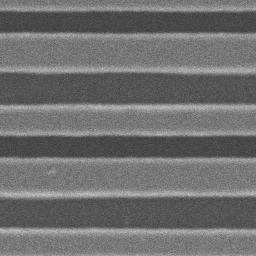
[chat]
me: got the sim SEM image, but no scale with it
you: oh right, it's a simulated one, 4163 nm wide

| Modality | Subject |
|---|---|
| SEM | lines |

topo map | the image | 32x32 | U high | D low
UUUUUUUUUUUUUUUUUUUUUUUUUUUUUUUU
DDDDDDDDDDDDDDDDDDDDDDDDDDDDDDDD
DDDDDDDDDDDDDDDDDDDDDDDDDDDDDDDD
DDDDDDDDDDDDDDDDDDDDDDDDDDDDDDDD
UUUUUUUUUUUUUUUUUUUUUUUUUUUUUUUU
UUUUUUUUUUUUUUUUUUUUUUUUUUUUUUUU
UUUUUUUUUUUUUUUUUUUUUUUUUUUUUUUU
UUUUUUUUUUUUUUUUUUUUUUUUUUUUUUUU
UUUUUUUUUUUUUUUUUUUUUUUUUUUUUUUU
DDDDDDDDDDDDDDDDDDDDDDDDDDDDDDDD
DDDDDDDDDDDDDDDDDDDDDDDDDDDDDDDD
DDDDDDDDDDDDDDDDDDDDDDDDDDDDDDDD
DDDDDDDDDDDDDDDDDDDDDDDDDDDDDDDD
UUUUUUUUUUUUUUUUUUUUUUUUUUUUUUUU
UUUUUUUUUUUUUUUUUUUUUUUUUUUUUUUU
UUUUUUUUUUUUUUUUUUUUUUUUUUUUUUUU
UUUUUUUUUUUUUUUUUUUUUUUUUUUUUUUU
DDDDDDDDDDDDDDDDDDDDDDDDDDDDDDDD
DDDDDDDDDDDDDDDDDDDDDDDDDDDDDDDD
DDDDDDDDDDDDDDDDDDDDDDDDDDDDDDDD
UUUUUUUUUUUUUUUUUUUUUUUUUUUUUUUU
UUUUUUUUUUUUUUUUUUUUUUUUUUUUUUUU
UUUUUUUUUUUUUUUUUUUUUUUUUUUUUUUU
UUUUUUUUUUUUUUUUUUUUUUUUUUUUUUUU
DDDDDDDDDDDDDDDDDDDDDDDDDDDDDDDD
DDDDDDDDDDDDDDDDDDDDDDDDDDDDDDDD
DDDDDDDDDDDDDDDDDDDDDDDDDDDDDDDD
DDDDDDDDDDDDDDDDDDDDDDDDDDDDDDDD
DDDDDDDDDDDDDDDDDDDDDDDDDDDDDDDD
UUUUUUUUUUUUUUUUUUUUUUUUUUUUUUUU
UUUUUUUUUUUUUUUUUUUUUUUUUUUUUUUU
UUUUUUUUUUUUUUUUUUUUUUUUUUUUUUUU